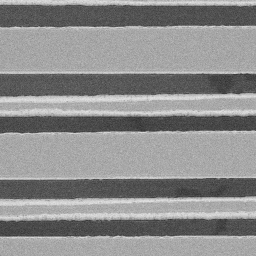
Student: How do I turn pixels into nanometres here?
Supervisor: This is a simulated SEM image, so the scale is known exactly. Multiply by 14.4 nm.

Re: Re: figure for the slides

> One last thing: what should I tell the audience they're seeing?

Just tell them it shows lines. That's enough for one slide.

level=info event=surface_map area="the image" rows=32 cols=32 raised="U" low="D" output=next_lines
DDDDDDDDDDDUUUUUUUUUUUUUUUUUUUUU
DDDDDDDDDDDDDDDDDDDDDDDDDDDDDDDD
DDDDDDDDDDDDDDDDDDDDDDDDDDDDDDDD
DUUUUUUUUUUUUUUUUUUUUUUUUUUUUUUU
UUUUUUUUUUUUUUUUUUUUUUUUUUUUUUUU
UUUUUUUUUUUUUUUUUUUUUUUUUUUUUUUU
UUUUUUUUUUUUUUUUUUUUUUUUUUUUUUUU
UUUUUUUUUUUUUUUUUUUUUUUUUUUUUUUU
UUUUUUUUUUUUUUUUUUUUUUUUUUUUUUUU
DDDDDDDDDDDDDDDDDDDDDDDDDDDDDDDD
DDDDDDDDDDDDDDDDDDDDDDDDDDDDDDDD
DDDDDDDDDDDDDDDDDDDDDDDDDDDDDDDD
UUUUUUUUUUUUUUUUUUUUUUUUUUUUUUUU
UUUUUUUUUUUUUUUUUUUUUUUUUUUUUUUU
DDDDDDDDDDDDDDDDDDDDDDDDDDDDDDDD
DDDDDDDDDDDDDDDDDDDDDDDDDDDDDDDD
DDDDDDDDDDDDDDDDDDDDUUDDUUUUUUUU
UUUUUUUUUUUUUUUUUUUUUUUUUUUUUUUU
UUUUUUUUUUUUUUUUUUUUUUUUUUUUUUUU
UUUUUUUUUUUUUUUUUUUUUUUUUUUUUUUU
UUUUUUUUUUUUUUUUUUUUUUUUUUUUUUUU
UUUUUUUUUUUUUUUUUUUUUUUUUUUUUUUU
DDDDDDDDDDDDDDDDDDDDDDDDDDDDDDDD
DDDDDDDDDDDDDDDDDDDDDDDDDDDDDDDD
DDDDDDDDDDDDDDDDDDDDDDDDDDDDDDDD
UUUUUUUUUUUUUUUUUUUUUUUUUUUUUUUU
UUUUUUUUUUUUUUUUUUUUUUUUUUUUUUUU
DDDDDDDDDDDDDDDDDDDDDDDDDDDDDDDD
DDDDDDDDDDDDDDDDDDDDDDDDDDDDDDDD
DDDDDDDDDDDDDDDDDDDDDDDDDDDDDDDD
UUUUUUUUUUUUUUUUUUUUUUUUUUUUUUUU
UUUUUUUUUUUUUUUUUUUUUUUUUUUUUUUU